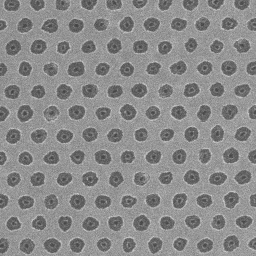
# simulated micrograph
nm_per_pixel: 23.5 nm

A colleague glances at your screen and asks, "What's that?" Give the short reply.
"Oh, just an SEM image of a regular array of ring-shaped grooves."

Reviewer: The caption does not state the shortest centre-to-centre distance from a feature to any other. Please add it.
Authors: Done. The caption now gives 580 nm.